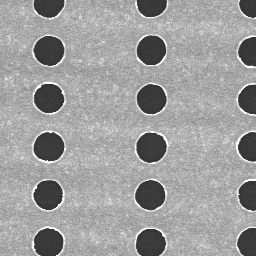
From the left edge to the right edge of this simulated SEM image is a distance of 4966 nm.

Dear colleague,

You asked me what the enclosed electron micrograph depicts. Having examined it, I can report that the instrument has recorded a regular array of holes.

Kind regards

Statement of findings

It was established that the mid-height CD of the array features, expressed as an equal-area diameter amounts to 30.1 pixels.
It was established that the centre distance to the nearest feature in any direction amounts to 0.931 um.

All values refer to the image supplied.